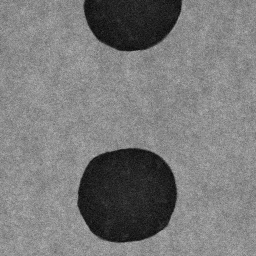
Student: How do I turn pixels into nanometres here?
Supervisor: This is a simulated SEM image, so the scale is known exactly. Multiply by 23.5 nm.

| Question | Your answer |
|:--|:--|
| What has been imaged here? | holes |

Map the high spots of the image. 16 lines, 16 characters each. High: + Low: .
+++++......+++++
++++++.....+++++
++++++....++++++
++++++++++++++++
++++++++++++++++
++++++++++++++++
++++++++++++++++
++++++++++++++++
++++++++++++++++
+++++++...++++++
+++++......+++++
+++++......+++++
+++++......+++++
+++++......+++++
++++++....++++++
++++++++++++++++